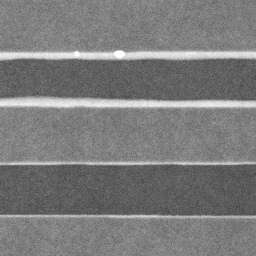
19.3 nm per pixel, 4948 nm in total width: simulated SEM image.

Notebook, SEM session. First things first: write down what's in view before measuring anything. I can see lines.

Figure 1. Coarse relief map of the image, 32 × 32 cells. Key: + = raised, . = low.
++++++++++++++++++++++++++++++++
++++++++++++++++++++++++++++++++
++++++++++++++++++++++++++++++++
++++++++++++++++++++++++++++++++
++++++++++++++++++++++++++++++++
++++++++++++++++++++++++++++++++
++++++++++++++++++++++++++++++++
................................
................................
................................
................................
................................
................................
++++++++++++++++++++++++++++++++
++++++++++++++++++++++++++++++++
++++++++++++++++++++++++++++++++
++++++++++++++++++++++++++++++++
++++++++++++++++++++++++++++++++
++++++++++++++++++++++++++++++++
++++++++++++++++++++++++++++++++
++.......................+......
................................
................................
................................
................................
................................
................................
++++++++++++++++++++++++++++++++
++++++++++++++++++++++++++++++++
++++++++++++++++++++++++++++++++
++++++++++++++++++++++++++++++++
++++++++++++++++++++++++++++++++